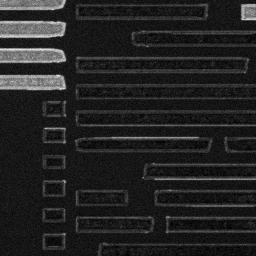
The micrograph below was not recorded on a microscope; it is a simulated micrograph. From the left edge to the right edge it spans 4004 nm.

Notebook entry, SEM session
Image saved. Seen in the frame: wiring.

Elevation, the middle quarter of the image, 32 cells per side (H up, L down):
LLLHHHHHHHHHHHHHHHHHHHHHHHHHHHHH
LLLHHHHHHHHHHHHHHHHHHHHHHHHHHHHH
LLLLLLLLLLLLLLLLLLLLLLLLLLLLLLLL
LLLLLLLLLLLLLLLLLLLLLLLLLLLLLLLL
LLLLLLLLLLLLLLLLLLLLLLLLLLLLLLLL
LLLHHHHHHHHHHHHHHHHHHHHHHHHHHHHH
LLLHHHHHHHHHHHHHHHHHHHHHHHHHHHHH
LLLHHHHHHHHHHHHHHHHHHHHHHHHHHHHH
LLLHHHHHHHHHHHHHHHHHHHHHHHHHHHHH
LLLLLLLLLLLLLLLLLLLLLLLLLLLLLLLL
LLLLLLLLLLLLLLLLLLLLLLLLLLLLLLLL
LLLLLLLLLLLLLLLLLLLLLLLLLLLLLLLL
LLLHHHHHHHHHHHHHHHHHHHHHHHHHHHHH
LLLHHHHHHHHHHHHHHHHHHHHHHHHHHHHH
LLLHHHHHHHHHHHHHHHHHHHHHHHHHHHHH
LLLLLLLLLLLLLLLLLLLLLLLLLLLLLLLL
LLLLLLLLLLLLLLLLLLLLLLLLLLLLLLLL
LLLLLLLLLLLLLLLLLLLLLLLLLLLLLLLL
LLLLLLLLLLLLLLLLLLLLLLLLLLLLLLLL
LLLHHHHHHHHHHHHHHHHHHHHHHHHHHHHH
LLLHHHHHHHHHHHHHHHHHHHHHHHHHHHHH
LLLLHHHHHHHHHHHHHHHHHHHHHHHHHHHH
LLLLLLLLLLLLLLLLLLLLLLLLLLLLLLLL
LLLLLLLLLLLLLLLLLLLLLLLLLLLLLLLL
LLLLLLLLLLLLLLLLLLLLLLLLLLLLLLLL
LLLLLLLLLLLLLLLLLLLLHHHHHHHHHHHH
LLLLLLLLLLLLLLLLLLLLHHHHHHHHHHHH
LLLLLLLLLLLLLLLLLLLLHHHHHHHHHHHH
LLLLLLLLLLLLLLLLLLLLHHHLLLLLLLLL
LLLLLLLLLLLLLLLLLLLLLLLLLLLLLLLL
LLLLLLLLLLLLLLLLLLLLLLLLLLLLLLLL
LLLLLLLLLLLLLLLLLLLLLLLLLLLLLLLL